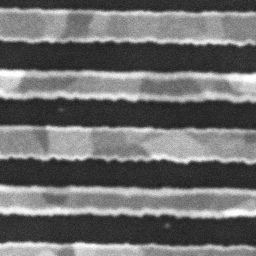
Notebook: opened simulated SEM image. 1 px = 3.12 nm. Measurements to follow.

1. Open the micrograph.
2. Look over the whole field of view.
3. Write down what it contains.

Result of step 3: lines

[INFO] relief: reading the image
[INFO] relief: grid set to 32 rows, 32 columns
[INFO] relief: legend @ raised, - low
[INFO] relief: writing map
--------------------------------
@@@@@@@@@@@@@-@-@@--------------
@@@@@@@@@@@@@@@@@@@@@@@@@@@@@@@@
@@@@@@@@@@@@@@@@@@@@@@@@@@@@@@@@
@@@@@@@@@@@@@@@@@@@@@@@@@@@@@@@@
-----------------------------@@-
--------------------------------
--------------------------------
--------------------------------
@@@@@@@@@@@@@@@@@@@@@@@@@@@@@@@@
@@@@@@@@@@@@@@@@@@@@@@@@@@@@@@@@
@@@@@@@@@@@@@@@@@@@@@@@@@@@@@@@@
---------------------@@------@@@
--------------------------------
--------------------------------
--------------------------------
@@@@@@@@@@@@@@@@@@@@@@@@@@@@@@@@
@@@@@@@@@@@@@@@@@@@@@@@@@@@@@@@@
@@@@@@@@@@@@@@@@@@@@@@@@@@@@@@@@
@@@@@@@@@@@@@@@@@@@@@@@@@@@@@@@@
--------------------------------
--------------------------------
--------------------------------
@--@@---------------------------
@@@@@@@@@@@@@@@@@@@@@@@@@@@@@@@@
@@@@@@@@@@@@@@@@@@@@@@@@@@@@@@@@
@@@@@@@@@@-@@@@@@@@@@@@@@@@@@@@@
--------------------------------
--------------------------------
--------------------------------
-@@@@@----@---------------------
@@@@@@@@@@@@@@@@@@@@@@@@@@@@@@@@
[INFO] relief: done